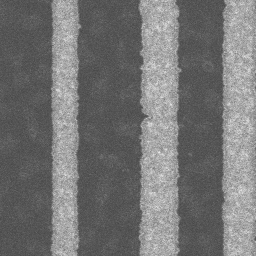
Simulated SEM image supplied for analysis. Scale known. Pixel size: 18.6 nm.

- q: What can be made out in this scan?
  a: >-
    one or a few lines or trenches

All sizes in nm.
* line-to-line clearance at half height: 578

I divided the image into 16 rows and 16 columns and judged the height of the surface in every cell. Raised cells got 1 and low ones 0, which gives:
1110011110011100
1110011110011100
1110011110011100
1110011110011100
1110011110011100
1110011110011100
1110011110011100
1110011110011100
1110011110011100
1110011110011100
1110011110011100
1110011110011100
1110011110011100
1110011110011100
1110011110011100
1110011110011100